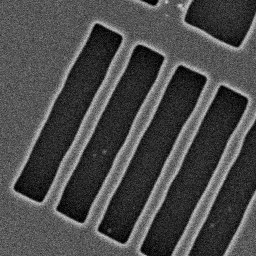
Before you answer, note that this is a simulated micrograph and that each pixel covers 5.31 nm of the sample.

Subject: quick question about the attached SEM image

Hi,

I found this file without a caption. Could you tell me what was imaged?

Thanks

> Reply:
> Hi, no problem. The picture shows groups of lines, slits or small figures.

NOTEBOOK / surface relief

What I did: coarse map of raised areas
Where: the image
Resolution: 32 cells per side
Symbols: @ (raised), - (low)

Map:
@@@@@@@@@@@@@@@@@@@-@@@@--------
@@@@@@@@@@@@@@@@@@@@@@@---------
@@@@@@@@@@@@@@@@@@@@@@@---------
@@@@@@@@@@@@-@@@@@@@@@@@@------@
@@@@@@@@@@@----@@@@@@@@@@@-----@
@@@@@@@@@@@----@@@@@@@@@@@@@--@@
@@@@@@@@@@-----@@---@@@@@@@@@@@@
@@@@@@@@@@----@@----@@@@@@@@@@@@
@@@@@@@@@-----@@----@@--@@@@@@@@
@@@@@@@@-----@@-----@@----@@@@@@
@@@@@@@@-----@@----@@-----@@@@@@
@@@@@@@@----@@-----@@----@@--@@@
@@@@@@@-----@@----@@-----@@----@
@@@@@@-----@@-----@@----@@-----@
@@@@@@-----@@----@@-----@@----@@
@@@@@@----@@-----@@----@@-----@@
@@@@@-----@@----@@-----@@----@@-
@@@@@----@@-----@@----@@-----@--
@@@@-----@@----@@-----@@----@@--
@@@@----@@-----@@----@@-----@@--
@@@-----@@----@@-----@@----@@---
@@@----@@-----@@----@@-----@@---
@@-----@@----@@-----@@----@@----
@@----@@-----@@----@@-----@@----
@@@---@@----@@-----@@----@@-----
@@@@@@@-----@@----@@-----@@----@
@@@@@@@----@@-----@@----@@-----@
@@@@@@@@@--@@----@@-----@@----@@
@@@@@@@@@@@@-----@@----@@-----@@
@@@@@@@@@@@@@---@@-----@@----@@@
@@@@@@@@@@@@@@@@@@----@@-----@@@
@@@@@@@@@@@@@@@@@@----@@----@@@@